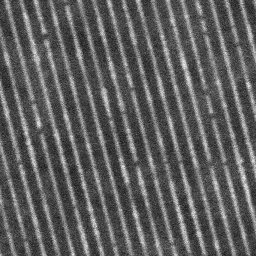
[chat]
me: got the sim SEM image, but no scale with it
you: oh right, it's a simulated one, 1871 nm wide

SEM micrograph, parallel lines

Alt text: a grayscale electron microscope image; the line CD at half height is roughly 22.1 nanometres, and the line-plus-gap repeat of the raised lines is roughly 104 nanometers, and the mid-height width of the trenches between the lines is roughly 10.9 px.